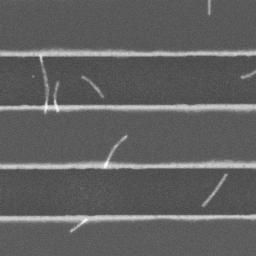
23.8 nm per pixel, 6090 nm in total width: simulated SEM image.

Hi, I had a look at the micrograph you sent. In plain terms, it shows lines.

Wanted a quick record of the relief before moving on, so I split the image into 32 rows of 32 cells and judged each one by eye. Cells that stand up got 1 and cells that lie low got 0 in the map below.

11111111111111111111111111111111
11111111111111111111111111111111
11111111111111111111111111111111
11111111111111111111111111111111
11111111111111111111111111111111
11111111111111111111111111111111
11111111111111111111111111111111
00000000000000000000000000000000
00000000000000000000000000000000
00000000000000000000000000000000
00000000000000000000000000000000
00000000000000000000000000000000
00000000000000000000000000000000
11111111111111111111111111111111
11111111111111111111111111111111
11111111111111111111111111111111
11111111111111111111111111111111
11111111111111111111111111111111
11111111111111111111111111111111
11111111111111111111111111111111
11111111111111111111111111111111
00000000000000000000000000000000
00000000000000000000000000000000
00000000000000000000000000000000
00000000000000000000000000000000
00000000000000000000000000000000
00000000000000000000000000000000
11111111111111111111111111111111
11111111111111111111111111111111
11111111111111111111111111111111
11111111111111111111111111111111
11111111111111111111111111111111